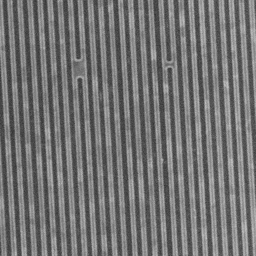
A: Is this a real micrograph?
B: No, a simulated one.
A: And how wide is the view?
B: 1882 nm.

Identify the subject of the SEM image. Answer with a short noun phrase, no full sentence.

parallel lines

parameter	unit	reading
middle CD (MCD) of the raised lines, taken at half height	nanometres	25.7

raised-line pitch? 73.9 nm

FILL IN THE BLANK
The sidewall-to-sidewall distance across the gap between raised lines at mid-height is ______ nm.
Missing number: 44